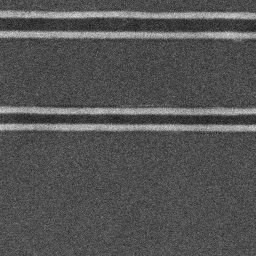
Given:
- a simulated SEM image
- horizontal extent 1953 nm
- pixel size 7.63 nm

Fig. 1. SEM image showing one or a few lines or trenches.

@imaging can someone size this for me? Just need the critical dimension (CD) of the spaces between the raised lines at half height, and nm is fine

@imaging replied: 583